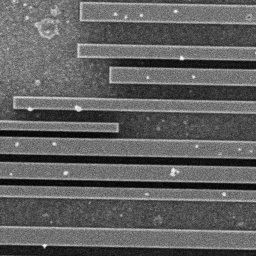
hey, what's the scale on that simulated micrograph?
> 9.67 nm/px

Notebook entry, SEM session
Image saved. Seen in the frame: groups of lines, slits or small figures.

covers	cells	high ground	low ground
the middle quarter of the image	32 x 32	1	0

00000000000000000000000000000000
00000000000011111111111111111111
00000000000011111111111111111111
00000000000111111111111111111111
00000000000111111111111111111111
00000000000000000000000000000000
00000000000000000000000000000000
00000000000000000000000000000000
00000000000000000000000000000000
11111111111111111111111111111111
11111111111111111111111111111111
00011000111111111111111111111111
00000000000000000000000000000000
00000000000000000000000000000000
10000000000000000000000000000000
11111111111111000000000000000000
11111111111111000000000000000000
00000000000000000000000000000000
00000000000000000000000000000000
11111111111111111111111111111111
11111111111111111111111111111111
11111111111111111111111111111111
11111111111111111111111111111111
00000000000000000000000000000000
00000000000000000000000000000000
11111111111111111111111111111111
11111111111111111111111111111111
11111111111111111111111111111111
11111111111111111111111111111111
00000000000000000000000000000011
00000000000000000000000000000000
11111111111111111111111111111111